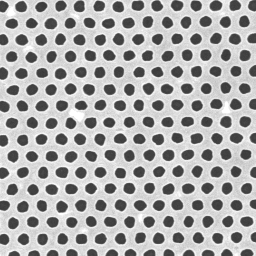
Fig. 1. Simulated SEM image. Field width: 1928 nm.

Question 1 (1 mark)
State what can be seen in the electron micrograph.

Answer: a regular array of holes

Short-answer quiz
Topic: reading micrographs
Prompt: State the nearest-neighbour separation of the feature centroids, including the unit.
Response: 139 nanometres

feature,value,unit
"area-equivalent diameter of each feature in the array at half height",85.4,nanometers